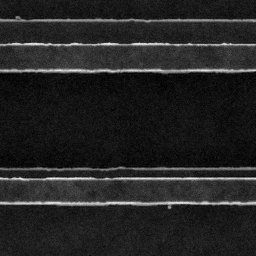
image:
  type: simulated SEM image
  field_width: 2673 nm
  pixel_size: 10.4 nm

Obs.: lines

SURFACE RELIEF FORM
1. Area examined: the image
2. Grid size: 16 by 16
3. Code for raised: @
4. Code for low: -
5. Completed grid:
----------------
@@@@@@@@@@@@@@@@
@@@@@@@@@@@@@@@@
@@@@@@@@@@@@@@@@
----------------
----------------
----------------
----------------
----------------
----------------
----------------
@@@@@@@@@@@@@@@@
@@@@@@@@@@@@@@@@
----------------
----------------
----------------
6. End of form